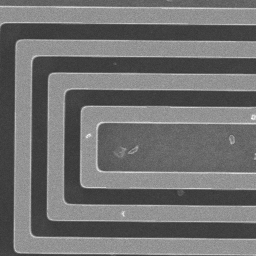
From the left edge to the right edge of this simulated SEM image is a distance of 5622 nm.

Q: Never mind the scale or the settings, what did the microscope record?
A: groups of lines, slits or small figures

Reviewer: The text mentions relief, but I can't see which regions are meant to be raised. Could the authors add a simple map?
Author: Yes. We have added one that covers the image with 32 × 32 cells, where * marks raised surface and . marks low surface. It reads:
................................
********************************
********************************
................................
................................
..******************************
..******************************
..**............................
..**............................
..**..**************************
..**..**************************
..**..**........................
..**..**........................
..**..**..**********************
..**..**..**********************
..**..**..***...................
..**..**..**....................
..**..**..**....................
..**..**..**....................
..**..**..**....................
..**..**..**....................
..**..**..****..................
..**..**..**********************
..**..**......******************
..**..**........................
..**..***.......................
..**..**************************
..**..**************************
..**............................
..**............................
..******************************
..******************************